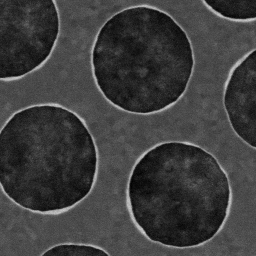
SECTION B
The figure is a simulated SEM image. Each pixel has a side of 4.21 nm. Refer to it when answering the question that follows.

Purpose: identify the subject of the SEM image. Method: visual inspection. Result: holes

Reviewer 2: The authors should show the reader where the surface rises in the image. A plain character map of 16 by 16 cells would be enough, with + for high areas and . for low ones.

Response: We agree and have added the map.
....++++.++++...
....+++....+++++
...+++......++++
...+++......+++.
..++++......+++.
++++++......++..
+++++++....+++..
+....+++++++++..
......+++++++++.
......+++....+++
......++......++
......++......++
+....+++......++
++++++++......++
+++++++++.....++
+++...++++++++++